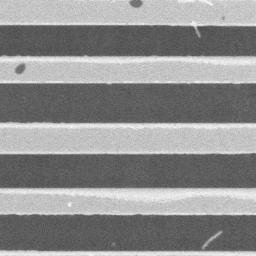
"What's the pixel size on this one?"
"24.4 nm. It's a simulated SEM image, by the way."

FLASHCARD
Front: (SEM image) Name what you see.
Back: lines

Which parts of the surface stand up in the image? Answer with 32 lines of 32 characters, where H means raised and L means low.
HHHHHHHHHHHHHHHHHHHHHHHHHHHHHHHH
HHHHHHHHHHHHHHHHHHHHHHHHHHHHHHHH
HHHHHHHHHHHHHHHHHHHHHHHHHHHHHHHH
LLLLLLLLLLLLLLLLLLLLLLLLLLLLLLLL
LLLLLLLLLLLLLLLLLLLLLLLLLLLLLLLL
LLLLLLLLLLLLLLLLLLLLLLLLLLLLLLLL
LLLLLLLLLLLLLLLLLLLLLLLLLLLLLLLL
HHHHHHHHHHHHHHHHHHHHHHHHHHHHHHHH
HHHHHHHHHHHHHHHHHHHHHHHHHHHHHHHH
HHHHHHHHHHHHHHHHHHHHHHHHHHHHHHHH
LLLLLLLLLLLLLLLLLLLLLLLLLLLLLLLL
LLLLLLLLLLLLLLLLLLLLLLLLLLLLLLLL
LLLLLLLLLLLLLLLLLLLLLLLLLLLLLLLL
LLLLLLLLLLLLLLLLLLLLLLLLLLLLLLLL
LLLLLLLLLLLLLLLLLLLLLLLLLLLLLLLL
HHHHHHHHHHHHHHHHHHHHHHHHHHHHHHHH
HHHHHHHHHHHHHHHHHHHHHHHHHHHHHHHH
HHHHHHHHHHHHHHHHHHHHHHHHHHHHHHHH
HHHHHHHHHHHHHHHHHHHHHHHHHHHHHHHH
LLLLLLLLLLLLLLLLLLLLLLLLLLLLLLLL
LLLLLLLLLLLLLLLLLLLLLLLLLLLLLLLL
LLLLLLLLLLLLLLLLLLLLLLLLLLLLLLLL
LLLLLLLLLLLLLLLLLLLLLLLLLLLLLLLL
LLLLLLLLLLLLLLLLLLLLLLLLLLLLLLLL
HHHHHHHHHHHHHHHHHHHHHHHHHHHHHHHH
HHHHHHHHHHHHHHHHHHHHHHHHHHHHHHHH
HHHHHHHHHHHHHHHHHHHHHHHHHHHHHHHH
LLLLLLLLLLLLLLLLLLLLLLLLLLLLLLLL
LLLLLLLLLLLLLLLLLLLLLLLLLLLLLLLL
LLLLLLLLLLLLLLLLLLLLLLLLLLLLLLLL
LLLLLLLLLLLLLLLLLLLLLLLLLLLLLLLL
HHHHHHHHHHHHHHHHHHHHHHHHHHHLLLLL